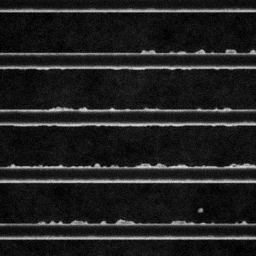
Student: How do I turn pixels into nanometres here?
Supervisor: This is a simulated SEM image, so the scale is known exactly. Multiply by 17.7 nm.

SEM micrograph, lines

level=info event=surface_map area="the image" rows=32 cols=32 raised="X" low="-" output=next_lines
XXXXXXXXXXXXXXXXXXXXXXXXXXXXXXXX
--------------------------------
--------------------------------
--------------------------------
--------------------------------
--------------------------------
--------------------------------
XXXXXXXXXXXXXXXXXXXXXXXXXXXXXXXX
XXXXXXXXXXXXXXXXXXXXXXXXXXXXXXXX
--------------------------------
--------------------------------
--------------------------------
--------------------------------
--------------------------------
XXXXXXXXXXXXXXXXXXXXXXXXXXXXXXXX
XXXXXXXXXXXXXXXXXXXXXXXXXXXXXXXX
--------------------------------
--------------------------------
--------------------------------
--------------------------------
--------------------------------
XXXXXXXXXXXXXXXXXXXXXXXXXXXXXXXX
XXXXXXXXXXXXXXXXXXXXXXXXXXXXXXXX
--------------------------------
--------------------------------
--------------------------------
--------------------------------
--------------------------------
XXXXXXXXXXXXXXXXXXXXXXXXXXXXXXXX
XXXXXXXXXXXXXXXXXXXXXXXXXXXXXXXX
--------------------------------
--------------------------------